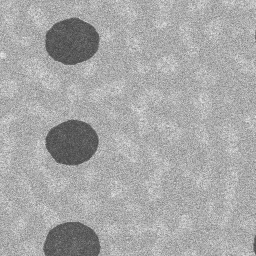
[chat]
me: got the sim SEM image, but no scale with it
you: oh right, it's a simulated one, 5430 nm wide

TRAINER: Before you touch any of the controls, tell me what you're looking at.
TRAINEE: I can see holes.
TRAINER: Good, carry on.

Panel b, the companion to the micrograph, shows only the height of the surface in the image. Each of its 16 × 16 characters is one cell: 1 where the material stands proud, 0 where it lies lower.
1111111111111111
1110001111111111
1110001111111111
1110001111111111
1111111111111111
1111111111111111
1111111111111111
1111111111111111
1110001111111111
1110001111111111
1111111111111111
1111111111111111
1111111111111111
1111111111111111
1110001111111111
1110001111111111